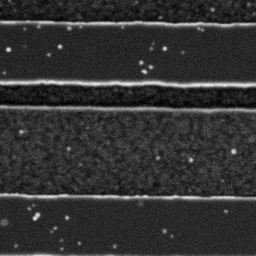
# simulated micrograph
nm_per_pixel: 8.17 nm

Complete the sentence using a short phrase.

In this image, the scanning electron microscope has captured lines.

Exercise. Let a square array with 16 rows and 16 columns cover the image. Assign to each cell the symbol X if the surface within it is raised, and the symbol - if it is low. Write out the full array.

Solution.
----------------
XXXXXXXXXXXXXXXX
XXXXXXXXXXXXXXXX
XXXXXXXXXXXXXXXX
XXXXXXXXXXXXXXXX
----------------
----------------
----------------
----------------
----------------
----------------
----------------
XXXXXXXXXXXXXXXX
XXXXXXXXXXXXXXXX
XXXXXXXXXXXXXXXX
XXXXXXXXXXXXXXXX